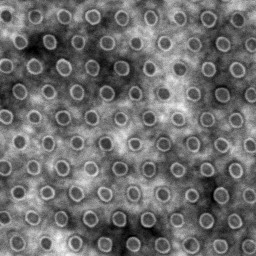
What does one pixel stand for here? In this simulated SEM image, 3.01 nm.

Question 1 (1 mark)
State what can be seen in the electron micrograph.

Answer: a regular array of raised bodies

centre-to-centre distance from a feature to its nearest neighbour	0.0858	um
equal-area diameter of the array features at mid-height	41.9	nm